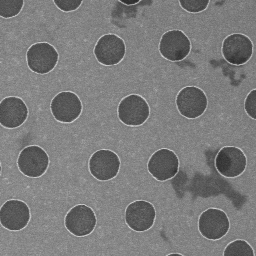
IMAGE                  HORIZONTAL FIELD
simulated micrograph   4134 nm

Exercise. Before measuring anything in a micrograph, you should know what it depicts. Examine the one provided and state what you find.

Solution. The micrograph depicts a regular array of holes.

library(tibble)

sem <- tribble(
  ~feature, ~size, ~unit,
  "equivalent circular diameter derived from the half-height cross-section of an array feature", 498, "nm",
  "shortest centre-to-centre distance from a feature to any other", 0.955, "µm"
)